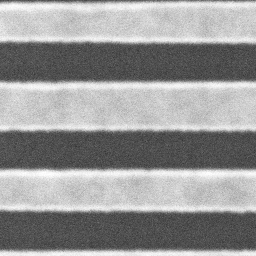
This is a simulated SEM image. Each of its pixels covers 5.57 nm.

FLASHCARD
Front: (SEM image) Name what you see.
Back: lines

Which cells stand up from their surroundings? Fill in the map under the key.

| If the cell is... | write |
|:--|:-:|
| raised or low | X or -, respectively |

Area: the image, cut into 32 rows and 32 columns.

XXXXXXXXXXXXXXXXXXXXXXXXXXXXXXXX
XXXXXXXXXXXXXXXXXXXXXXXXXXXXXXXX
XXXXXXXXXXXXXXXXXXXXXXXXXXXXXXXX
XXXXXXXXXXXXXXXXXXXXXXXXXXXXXXXX
XXXXXXXXXXXXXXXXXXXXXXXXXXXXXXXX
--------------------------------
--------------------------------
--------------------------------
--------------------------------
--------------------------------
XXX------XX--X-XXXXXXXXXXXXXXXXX
XXXXXXXXXXXXXXXXXXXXXXXXXXXXXXXX
XXXXXXXXXXXXXXXXXXXXXXXXXXXXXXXX
XXXXXXXXXXXXXXXXXXXXXXXXXXXXXXXX
XXXXXXXXXXXXXXXXXXXXXXXXXXXXXXXX
XXXXXXXXXXXXXXXXXXXXXXXXXXXXXXXX
--------------------------------
--------------------------------
--------------------------------
--------------------------------
--------------------------------
XXXXXXXXXXXXXXXXXXXXXXXXXXXXXXXX
XXXXXXXXXXXXXXXXXXXXXXXXXXXXXXXX
XXXXXXXXXXXXXXXXXXXXXXXXXXXXXXXX
XXXXXXXXXXXXXXXXXXXXXXXXXXXXXXXX
XXXXXXXXXXXXXXXXXXXXXXXXXXXXXXXX
------------------------------X-
--------------------------------
--------------------------------
--------------------------------
--------------------------------
-------------XXX-X-XXXXX--XXX---